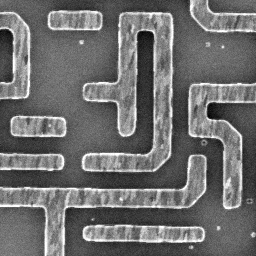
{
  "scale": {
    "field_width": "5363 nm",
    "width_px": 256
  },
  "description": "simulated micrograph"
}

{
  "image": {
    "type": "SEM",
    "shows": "wiring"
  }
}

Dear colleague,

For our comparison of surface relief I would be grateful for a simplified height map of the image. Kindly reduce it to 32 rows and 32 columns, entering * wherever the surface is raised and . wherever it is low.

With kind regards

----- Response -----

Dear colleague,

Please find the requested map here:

........................**......
.......*****............***.....
***...*******..*******..********
****..******...*******...*******
..**...........**..***..........
..**...........**..***..........
..**...........**..**...........
..**...........**..**...........
..**...........**..***..........
..**...........**..***..........
****.......******..**...........
****......*******..**...********
...........******..**...********
...............**..**...**......
...............**..**...**......
.*******.......**..**...*****...
..******.......**..**...******..
...................**......***..
...................**.......**..
********...**********...*...**..
********..**********....**..**..
........................**..**..
.......................***..**..
.......................***..**..
*************************...**..
************************....**..
......**........................
......**........................
......**...**************.......
......**..****************......
......**........................
......**........................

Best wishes